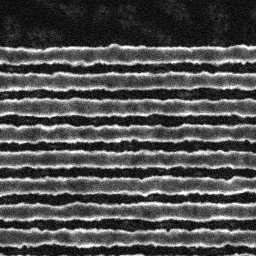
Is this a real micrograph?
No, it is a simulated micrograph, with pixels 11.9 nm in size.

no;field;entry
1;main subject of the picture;parallel lines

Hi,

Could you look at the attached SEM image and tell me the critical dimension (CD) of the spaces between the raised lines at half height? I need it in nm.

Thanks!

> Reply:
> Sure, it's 128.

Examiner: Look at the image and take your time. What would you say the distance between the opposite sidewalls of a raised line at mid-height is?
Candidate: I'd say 183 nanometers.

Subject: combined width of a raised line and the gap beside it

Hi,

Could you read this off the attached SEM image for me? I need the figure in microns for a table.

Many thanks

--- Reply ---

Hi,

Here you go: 0.311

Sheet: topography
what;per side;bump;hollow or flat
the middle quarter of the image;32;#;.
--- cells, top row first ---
................................
................................
##........####.###.#.....######.
################################
################################
################################
#..........##...................
................................
..##............................
################################
################################
################################
##.###################..#######.
................................
................................
##........#.......#.#..#.....###
################################
################################
################################
...........#....................
................................
................................
################################
################################
################################
##.#########################..##
................................
................................
.#.####.#.#.#.......#########.#.
################################
################################
################################